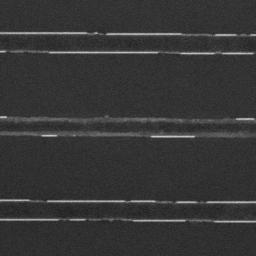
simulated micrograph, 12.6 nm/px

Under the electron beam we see lines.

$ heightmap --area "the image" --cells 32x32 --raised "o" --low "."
................................
................................
................................
................................
oooooooooooooooooooooooooooooooo
oooooooooooooooooooooooooooooooo
....................oooooooooooo
................................
................................
................................
................................
................................
................................
................................
................................
oooooooooooooooooooooooooooooooo
oooooooooooooooooooooooooooooooo
................................
................................
................................
................................
................................
................................
................................
................................
oooooooooooooooooooooooooooooooo
oooooooooooooooooooooooooooooooo
........................oooooooo
................................
................................
................................
................................